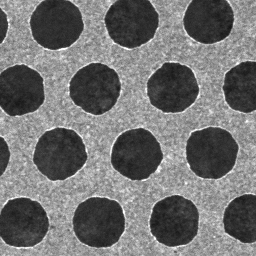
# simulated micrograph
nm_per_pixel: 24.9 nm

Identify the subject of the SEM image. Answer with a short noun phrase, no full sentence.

holes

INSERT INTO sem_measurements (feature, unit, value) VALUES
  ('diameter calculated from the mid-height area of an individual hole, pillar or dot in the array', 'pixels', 52.1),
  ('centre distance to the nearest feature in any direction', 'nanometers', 1860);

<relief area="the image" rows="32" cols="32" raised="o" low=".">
ooooo....ooooo.....ooooo.....ooo
.ooo......ooo.......ooo......ooo
.ooo......ooo.......ooo......ooo
.ooo.......oo.......ooo......ooo
.ooo......ooo......ooooo....oooo
ooooo....oooooo...ooooooo..ooooo
oooooooooooooooooooooooooooooooo
oooooooooooooooooooooooooooooooo
o...oooooo....oooooo....ooooo...
.....oooo......oooo.....oooo....
.....oooo......ooo.......ooo....
......ooo......ooo.......ooo....
......ooo......oooo......ooo....
.....ooooo....ooooo....oooooo...
o.oooooooooooooooooooooooooooooo
oooooooooooooooooooooooooooooooo
oooooo....ooooo....ooooo.....ooo
.oooo.....oooo......ooo......ooo
.ooo.......ooo......ooo.......oo
.ooo.......ooo......ooo.......oo
.ooo.......ooo......ooo......ooo
.oooo.....ooooo....ooooo.....ooo
oooooo..oooooooo..oooooooooooooo
oooooooooooooooooooooooooooooooo
ooooooooooooooooooooo..ooooooo..
o....ooooo.....oooo.....oooo....
......ooo......oooo......ooo....
......ooo.......ooo......ooo....
......ooo.......ooo......ooo....
......oooo.....oooo.....ooooo...
o....ooooo....oooooo...ooooooooo
oooooooooooooooooooooooooooooooo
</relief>